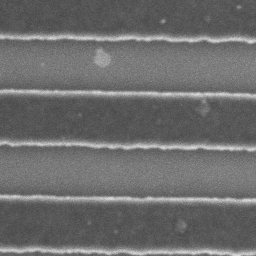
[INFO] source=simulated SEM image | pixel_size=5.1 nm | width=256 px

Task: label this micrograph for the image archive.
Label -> lines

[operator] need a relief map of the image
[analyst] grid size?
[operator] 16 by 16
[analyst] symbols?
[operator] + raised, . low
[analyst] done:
++++++++++++++++
++++++++++++++++
..........++++++
................
................
................
++++++++++++++++
++++++++++++++++
++++++++++++++++
................
................
................
++++++++++++++++
++++++++++++++++
++++++++++++++++
++++++++++++++++